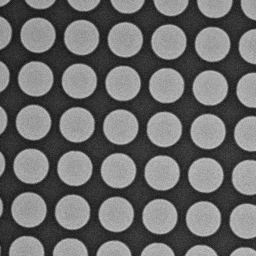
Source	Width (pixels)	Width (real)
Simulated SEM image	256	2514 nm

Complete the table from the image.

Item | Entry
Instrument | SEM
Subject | an array of small figures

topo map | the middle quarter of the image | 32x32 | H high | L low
LLHHHHLLLLLLLLLLLLLLLLLLLLLLLLLL
LHHHHHHLLLLLHHHHHLLLLLLLHHHLLLLL
HHHHHHHHLLLHHHHHHHLLLLLHHHHHHLLL
HHHHHHHHLLLHHHHHHHHLLLHHHHHHHLLL
HHHHHHHHLLLHHHHHHHHLLLHHHHHHHHLL
HHHHHHHHLLLHHHHHHHHLLHHHHHHHHHLL
HHHHHHHHLLLHHHHHHHHLLHHHHHHHHHLL
LHHHHHHLLLLHHHHHHHLLLLHHHHHHHLLL
LLLLLLLLLLLLLHHHHLLLLLLHHHHHHLLL
LLLLLLLLLLLLLLLLLLLLLLLLHHHLLLLL
LLLLLLLLLLLLLLLLLLLLLLLLLLLLLLLL
LHHHHLLLLLLLLLLLLLLLLLLLLLLLLLLL
HHHHHHHLLLLHHHHHHLLLLLLHHHHLLLLL
HHHHHHHLLLLHHHHHHHLLLLHHHHHHLLLL
HHHHHHHLLLHHHHHHHHLLLHHHHHHHHLLL
HHHHHHHLLLHHHHHHHHLLLHHHHHHHHLLL
HHHHHHHLLLHHHHHHHHLLLHHHHHHHHLLL
HHHHHHHLLLHHHHHHHHLLLHHHHHHHHLLL
LHHHHHLLLLLHHHHHHHLLLHHHHHHHHLLL
LLLLLLLLLLLLHHHHLLLLLLHHHHHHLLLL
LLLLLLLLLLLLLLLLLLLLLLLLHHLLLLLL
LLLLLLLLLLLLLLLLLLLLLLLLLLLLLLLL
HHHHHLLLLLLLLLLLLLLLLLLLLLLLLLLL
HHHHHHLLLLLHHHHHLLLLLLHHHHHLLLLL
HHHHHHHLLLHHHHHHHLLLLHHHHHHHLLLL
HHHHHHHLLHHHHHHHHHLLLHHHHHHHLLLL
HHHHHHHLLHHHHHHHHHLLHHHHHHHHHLLH
HHHHHHHLLHHHHHHHHHLLHHHHHHHHHLLH
HHHHHHLLLLHHHHHHHLLLHHHHHHHHHLLH
HHHHHLLLLLHHHHHHHLLLLHHHHHHHLLLL
LLLLLLLLLLLLHHHLLLLLLLHHHHHLLLLL
LLLLLLLLLLLLLLLLLLLLLLLLLLLLLLLL